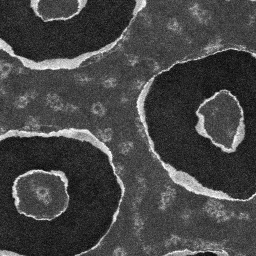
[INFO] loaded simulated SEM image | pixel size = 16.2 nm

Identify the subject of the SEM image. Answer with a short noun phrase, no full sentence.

ring-shaped grooves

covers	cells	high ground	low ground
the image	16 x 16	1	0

0011100001111111
0000000011111111
0000000111111111
1000001111111000
1111111111000000
1111111110000000
1111111110000110
1111111110001110
1110001110000110
0000000111000000
0000000111100000
0111000011110000
0111000011111111
0011000111111111
0000000111111111
0000001111111111